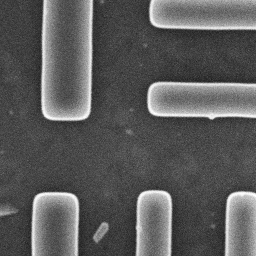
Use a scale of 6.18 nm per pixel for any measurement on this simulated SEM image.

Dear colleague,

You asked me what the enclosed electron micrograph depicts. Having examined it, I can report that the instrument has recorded groups of lines, slits or small figures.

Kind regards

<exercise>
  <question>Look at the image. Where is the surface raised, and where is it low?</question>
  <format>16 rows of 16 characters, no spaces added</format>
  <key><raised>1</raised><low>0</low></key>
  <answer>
0001110001111111
0001110000111111
0001110000000000
0001110000000000
0001110000000000
0001110000111111
0001110001111111
0000000000000000
0000000000000000
0000000000000000
0000000000000000
0000000000000000
0011100001100011
0011100001100011
0011100001100011
0011100001100011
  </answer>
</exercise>